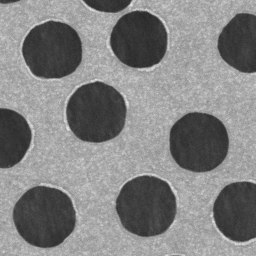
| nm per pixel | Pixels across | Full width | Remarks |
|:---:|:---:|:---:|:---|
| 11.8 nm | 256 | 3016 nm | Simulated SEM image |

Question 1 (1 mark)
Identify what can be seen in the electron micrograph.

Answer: holes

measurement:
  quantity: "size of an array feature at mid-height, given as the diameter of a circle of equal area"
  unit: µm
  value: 0.717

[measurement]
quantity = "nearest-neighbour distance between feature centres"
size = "972 nm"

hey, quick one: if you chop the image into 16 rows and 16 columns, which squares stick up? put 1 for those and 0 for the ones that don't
1111110011111111
1110111000111100
1100011000111100
1000011000111100
1100011111111110
1111100111111111
1111000011111111
0011000011100011
0011100111100011
0011111111100011
1111111111100111
1111111100111100
1000111000011000
1000011000011000
1000111100111100
1111111111111111